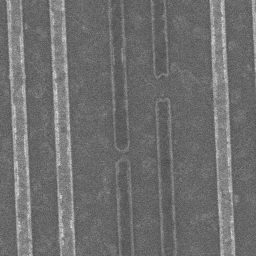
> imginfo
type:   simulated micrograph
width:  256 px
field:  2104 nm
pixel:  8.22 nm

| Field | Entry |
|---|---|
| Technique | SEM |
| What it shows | parallel lines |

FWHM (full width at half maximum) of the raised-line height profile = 112 nm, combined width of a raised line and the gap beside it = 0.416 µm